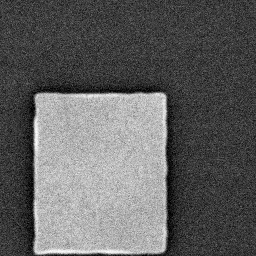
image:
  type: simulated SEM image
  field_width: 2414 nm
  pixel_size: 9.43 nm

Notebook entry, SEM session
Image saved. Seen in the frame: wiring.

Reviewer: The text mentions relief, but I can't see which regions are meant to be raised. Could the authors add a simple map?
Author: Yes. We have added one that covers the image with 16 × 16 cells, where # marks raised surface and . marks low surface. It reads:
................
................
................
................
................
................
..########......
..########......
..########......
..########......
..########......
..########......
..########......
..########......
..########......
..########......